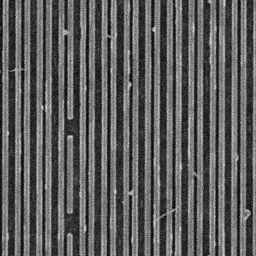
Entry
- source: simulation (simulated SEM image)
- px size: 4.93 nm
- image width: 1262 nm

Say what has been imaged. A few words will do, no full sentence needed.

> parallel lines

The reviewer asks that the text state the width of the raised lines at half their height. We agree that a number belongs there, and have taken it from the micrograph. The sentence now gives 25.9 nm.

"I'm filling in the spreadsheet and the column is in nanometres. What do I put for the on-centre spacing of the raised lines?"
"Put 53.3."